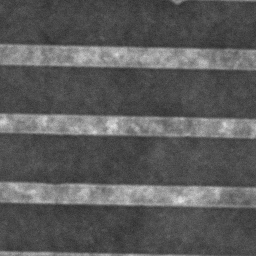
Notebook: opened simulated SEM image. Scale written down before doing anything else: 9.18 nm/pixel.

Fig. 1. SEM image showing one or a few lines or trenches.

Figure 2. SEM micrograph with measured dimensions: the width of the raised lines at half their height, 0.174 microns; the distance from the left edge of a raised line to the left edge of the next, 0.633 um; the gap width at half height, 454 nanometers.